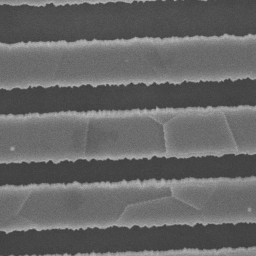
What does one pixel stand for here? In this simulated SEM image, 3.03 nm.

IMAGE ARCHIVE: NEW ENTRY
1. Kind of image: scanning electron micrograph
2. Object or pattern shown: lines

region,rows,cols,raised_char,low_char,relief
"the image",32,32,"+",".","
++++++.+++......................
................................
................................
................................
............................+.++
+.++++++++++++++++++++++++++++++
++++++++++++++++++++++++++++++++
++++++++++++++++++++++++++++++++
++++++++++++++++++++++++++++++++
++++++++++++++++++++++++++++++++
++++++++++++++++..+.............
................................
................................
........................++++++++
++++++++++++++++++++++++++++++++
++++++++++++++++++++++++++++++++
++++++++++++++++++++++++++++++++
++++++++++++++++++++++++++++++++
++++++++++++++++++++++++++++++++
++++++++++++++++++++++++++.+....
................................
................................
....................++.+++++++++
++++++++++++++++++++++++++++++++
++++++++++++++++++++++++++++++++
++++++++++++++++++++++++++++++++
++++++++++++++++++++++++++++++++
++++++++++++++++++++++++++++++++
+++++++++++.....................
................................
................................
..................+..+++++++++++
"